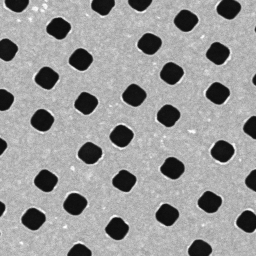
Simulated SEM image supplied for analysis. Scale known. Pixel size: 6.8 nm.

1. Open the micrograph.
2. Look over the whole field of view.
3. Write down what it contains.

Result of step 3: a regular array of holes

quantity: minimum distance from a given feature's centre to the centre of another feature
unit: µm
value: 0.273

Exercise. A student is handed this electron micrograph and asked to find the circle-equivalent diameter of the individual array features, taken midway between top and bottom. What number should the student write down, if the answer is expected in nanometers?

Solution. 147